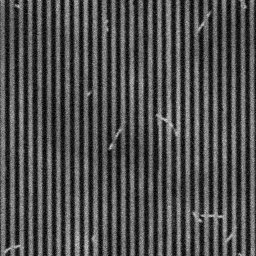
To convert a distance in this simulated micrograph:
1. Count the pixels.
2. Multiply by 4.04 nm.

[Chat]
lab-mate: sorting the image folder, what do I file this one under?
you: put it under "parallel lines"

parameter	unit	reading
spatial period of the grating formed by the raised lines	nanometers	37.3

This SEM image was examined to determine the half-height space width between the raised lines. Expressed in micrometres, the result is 0.0217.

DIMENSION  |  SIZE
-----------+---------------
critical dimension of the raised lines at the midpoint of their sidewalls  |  14.6 nm